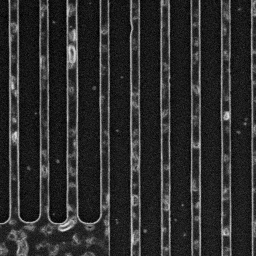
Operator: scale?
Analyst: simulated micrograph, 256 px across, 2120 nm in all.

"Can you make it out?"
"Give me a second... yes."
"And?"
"parallel lines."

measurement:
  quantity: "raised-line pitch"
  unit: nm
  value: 250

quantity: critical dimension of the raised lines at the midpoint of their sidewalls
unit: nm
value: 70.4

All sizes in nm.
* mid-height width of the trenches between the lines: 181